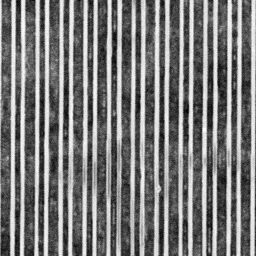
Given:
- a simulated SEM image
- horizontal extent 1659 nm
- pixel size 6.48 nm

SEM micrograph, parallel lines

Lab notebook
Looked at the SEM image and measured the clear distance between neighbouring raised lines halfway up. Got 65.6 nanometers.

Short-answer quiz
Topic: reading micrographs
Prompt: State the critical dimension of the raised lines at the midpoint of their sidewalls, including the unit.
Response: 24.3 nm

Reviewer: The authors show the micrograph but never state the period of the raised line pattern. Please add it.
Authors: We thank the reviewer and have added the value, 12 pixels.